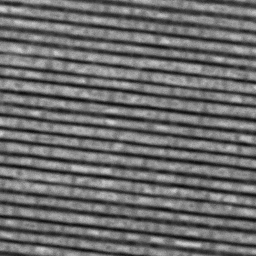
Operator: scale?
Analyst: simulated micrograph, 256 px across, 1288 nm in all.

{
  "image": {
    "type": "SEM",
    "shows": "parallel lines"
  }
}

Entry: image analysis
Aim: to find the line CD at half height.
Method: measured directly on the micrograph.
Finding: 42.5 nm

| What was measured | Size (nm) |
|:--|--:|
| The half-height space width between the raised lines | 21.2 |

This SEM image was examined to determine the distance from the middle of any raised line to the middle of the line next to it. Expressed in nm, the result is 62.6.